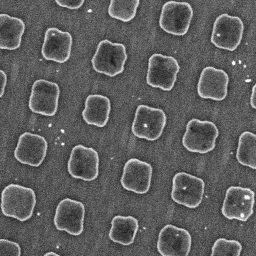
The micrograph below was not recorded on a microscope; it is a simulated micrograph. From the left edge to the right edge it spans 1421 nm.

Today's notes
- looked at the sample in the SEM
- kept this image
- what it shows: a regular array of raised bodies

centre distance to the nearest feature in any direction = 297 nanometres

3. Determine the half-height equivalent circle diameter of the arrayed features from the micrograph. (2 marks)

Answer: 0.179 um